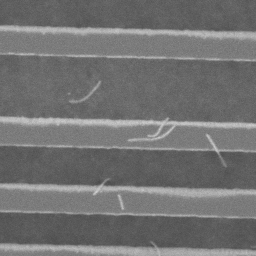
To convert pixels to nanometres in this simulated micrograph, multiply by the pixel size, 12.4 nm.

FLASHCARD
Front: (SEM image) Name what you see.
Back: lines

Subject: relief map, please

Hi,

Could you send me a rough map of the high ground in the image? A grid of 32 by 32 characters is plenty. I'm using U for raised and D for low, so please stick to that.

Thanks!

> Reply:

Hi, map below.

DDDDDDDDDDDDDDDDDDDDDDDDDDDDDDDD
DDDDDDDDDDDDDDDDDDDDDDDDDDDDDDDD
DDDDDDDDDDDDDDDDDDDDDDDDDDDDDDDD
UUUUUUUDDDDDDDDDDDDDDDDDDDDDDDDD
UUUUUUUUUUUUUUUUUUUUUUUUUUUUUUUU
UUUUUUUUUUUUUUUUUUUUUUUUUUUUUUUU
UUUUUUUUUUUUUUUUUUUUUUUUUUUUUUUU
DDDDDDDDDDDDDDDDDDDDDDDDDDDDDUUU
DDDDDDDDDDDDDDDDDDDDDDDDDDDDDDDD
DDDDDDDDDDDDDDDDDDDDDDDDDDDDDDDD
DDDDDDDDDDDDDDDDDDDDDDDDDDDDDDDD
DDDDDDDDDDDDDDDDDDDDDDDDDDDDDDDD
DDDDDDDDDDDDDDDDDDDDDDDDDDDDDDDD
DDDDDDDDDDDDDDDDDDDDDDDDDDDDDDDD
DDDDDDDDDDDDDDDDDDDDDDDDDDDDDDDD
UUUUUUUUUUUUUUUUUUUUUUUUUUUUUUUU
UUUUUUUUUUUUUUUUUUUUUUUUUUUUUUUU
UUUUUUUUUUUUUUUUUUUUUUUUUUUUUUUU
DDDDDDDDDDDDDUUUUUUUUUUUUUUUUUUU
DDDDDDDDDDDDDDDDDDDDDDDDDDDDDDDD
DDDDDDDDDDDDDDDDDDDDDDDDDDDDDDDD
DDDDDDDDDDDDDDDDDDDDDDDDDDDDDDDD
DDDDDDDDDDDDDDDDDDDDDDDDDDDDDDDD
UUUUUUUUUUUUUUUUUDDDDDDDDDDDDDDD
UUUUUUUUUUUUUUUUUUUUUUUUUUUUUUUU
UUUUUUUUUUUUUUUUUUUUUUUUUUUUUUUU
DDDUUUUUUUUUUUUUUUUUUUUUUUUUUUUU
DDDDDDDDDDDDDDDDDDDDDDDDDDDDDDDD
DDDDDDDDDDDDDDDDDDDDDDDDDDDDDDDD
DDDDDDDDDDDDDDDDDDDDDDDDDDDDDDDD
DDDDDDDDDDDDDDDDDDDDDDDDDDDDDDDD
UUUUUUUUUUUUUUUUUUUUUUUUUUUUUUUU